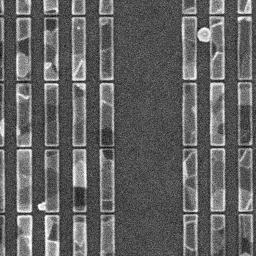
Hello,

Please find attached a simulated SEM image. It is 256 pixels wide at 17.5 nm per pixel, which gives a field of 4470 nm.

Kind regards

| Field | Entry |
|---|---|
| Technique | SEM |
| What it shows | wiring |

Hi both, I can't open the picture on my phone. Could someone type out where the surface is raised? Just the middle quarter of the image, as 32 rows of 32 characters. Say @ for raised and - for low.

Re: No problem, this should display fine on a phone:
--@@@----@@@------------------@@
--@@@----@@@------------------@@
--@@@----@@@------------------@@
--@@@----@@@------------------@@
--------------------------------
--@@@----@@@------------------@@
--@@@----@@@------------------@@
--@@@----@@@------------------@@
--@@@----@@@------------------@@
--@@@----@@@------------------@@
---@@----@@@------------------@@
---@@----@@@------------------@@
--@@@----@@@------------------@@
--@@@----@@@------------------@@
--@@@----@@@------------------@@
--@@@----@@@------------------@@
--@@@----@@@------------------@@
--@@@----@@@------------------@@
--@@@----@@@------------------@@
--@@@----@@@------------------@@
--------------------------------
---------@@@------------------@@
--@@@----@@@------------------@@
---@@----@@@------------------@@
---@@----@@@------------------@@
--@@@----@@@------------------@@
--@@@----@@@------------------@@
---@@----@@@------------------@@
---@@----@@@------------------@@
---@@----@@@------------------@@
---@@----@@@------------------@@
---@@----@@@------------------@@